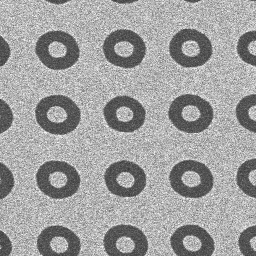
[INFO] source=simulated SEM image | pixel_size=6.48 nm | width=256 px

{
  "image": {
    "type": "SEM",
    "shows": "a regular array of ring-shaped grooves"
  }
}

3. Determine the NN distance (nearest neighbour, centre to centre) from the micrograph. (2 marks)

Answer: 421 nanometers